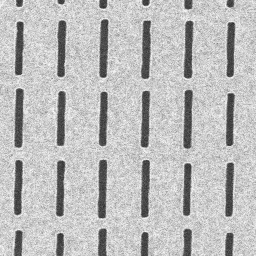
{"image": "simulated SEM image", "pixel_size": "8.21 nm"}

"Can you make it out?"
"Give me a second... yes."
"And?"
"a regular array of holes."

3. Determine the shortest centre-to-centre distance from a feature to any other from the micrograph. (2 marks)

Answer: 345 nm